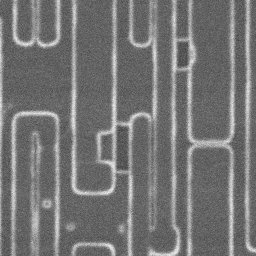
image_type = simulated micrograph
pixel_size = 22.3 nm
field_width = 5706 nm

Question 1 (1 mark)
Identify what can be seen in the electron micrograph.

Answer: wiring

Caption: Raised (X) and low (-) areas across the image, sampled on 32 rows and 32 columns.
--XXXXX--XXXXX--XXXXXX--XXXXX--X
--XXXXX--XXXXX--XXXXXX--XXXXX--X
--XXXXX--XXXXX--XXXXXX--XXXXX--X
--XXXXX--XXXXX--XXXXXX--XXXXX--X
--XXXXX--XXXXX--XXXXXX--XXXXX--X
---X-XX--XXXXX---XXXXX--XXXXX--X
---------XXXXX-----XXX--XXXXX--X
---------XXXXX-----XXX--XXXXX--X
---------XXXXX-----XXX--XXXXX--X
---------XXXXX-----XXX--XXXXX--X
---------XXXXX-----XXX--XXXXX--X
---------XXXXX-----XXX--XXXXX--X
---------XXXXX-----XXX--XXXXX--X
---------XXXXX-----XXX--XXXXX--X
--XXXXX--XXXXX---XXXXX--XXXXX--X
--XXXXX--XXXXX--XXXXXX--XXXXX--X
--XXXXX--XXXXX--XXXXXX--XXXXX--X
--XXXXX--XXX----XXXXXX--XXXXX--X
--XXXXX--XXX----XXXXXX--XXXXX--X
--XXXXX--XXX----XXXXXX--XXXXX--X
--XXXXX--XXXXX--XXXXXX--XXXXX--X
--XXXXX--XXXXX--XXXXXX--XXXXX--X
--XXXXX--XXXXX--XXXXXX--XXXXX--X
--XXXXX--XXXXX--XXXXXX--XXXXX--X
--XXXXX---------XXXXXX--XXXXX--X
--XXXXX---------XXXXXX--XXXXX--X
--XXXXX---------XXXXXX--XXXXX--X
--XXXXX---------XXXXXX--XXXXX--X
--XXXXX---------XXXXXX--XXXXX--X
--XXXXX---------XXXXXX--XXXXX--X
--XXXXX---------XXXXXX--XXXXX--X
--XXXXX--XXXXX--XXXXXX--XXXXX---